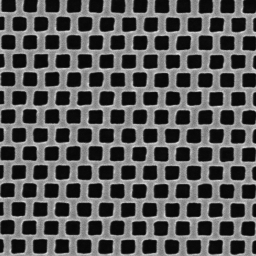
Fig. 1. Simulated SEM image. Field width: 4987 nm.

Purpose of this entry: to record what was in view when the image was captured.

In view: a regular array of holes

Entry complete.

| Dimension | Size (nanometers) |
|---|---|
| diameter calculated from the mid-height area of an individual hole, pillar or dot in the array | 312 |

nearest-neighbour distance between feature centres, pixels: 21.2